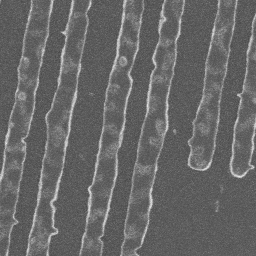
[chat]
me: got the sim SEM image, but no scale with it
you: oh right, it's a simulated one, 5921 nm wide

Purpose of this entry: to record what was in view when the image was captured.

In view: parallel lines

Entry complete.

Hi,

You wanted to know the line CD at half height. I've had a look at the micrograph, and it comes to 464 nm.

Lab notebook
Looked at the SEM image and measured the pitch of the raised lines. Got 1060 nm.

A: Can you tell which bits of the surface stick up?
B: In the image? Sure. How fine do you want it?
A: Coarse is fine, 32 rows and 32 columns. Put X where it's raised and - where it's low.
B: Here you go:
----XX---XX-----XX--XXX----XXX--
----XX---XX----XXX--XXX----XX---
----XX---XX----XXX--XXX----XX---
---XXX--XXX----XX---XX-----XX---
---XXX--XXX----XX---XX-----XX--X
---XXX--XXX----XX---XX----XXX--X
---XX---XX-----XX--XXX----XXX--X
---XX---XX----XXX--XXX----XXX--X
--XXX---XX----XX---XXX----XX---X
--XXX--XXX----XX---XXX----XX---X
--XXX--XXX----XX---XX----XXX--XX
--XX---XX----XXX---XX----XXX--XX
--XX---XX----XXX---XX----XXX--XX
--XX--XXX----XXX--XXX----XX---XX
-XXX--XXX----XXX--XXX----XX---XX
-XXX--XXX----XXX--XXX---XXX--XXX
-XXX--XXX----XX---XXX---XXX--XXX
-XX---XX-----XX--XXX----XXX--XXX
-XX---XX----XXX--XXX----XXX--XXX
-XX---XX----XXX--XXX----XXX--XX-
XXX--XXX----XXX--XXX----XX---XX-
XXX--XXX----XXX--XX----------XX-
XXX--XX-----XX---XX-------------
XX---XX----XXX--XXX-------------
XX---XX----XXX--XXX-------------
XX---XX----XXX--XXX-------------
XX--XXX----XX---XXX-------------
XX--XXX----XX---XXX-------------
XX--XXX----XX---XX--------------
X---XX----XXX---XX--------------
X---XX----XXX--XXX--------------
X--XXX----XXX--XX---------------